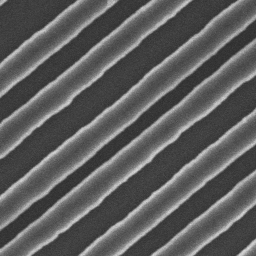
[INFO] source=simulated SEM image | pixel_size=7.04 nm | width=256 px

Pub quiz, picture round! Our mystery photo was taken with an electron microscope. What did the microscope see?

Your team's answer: lines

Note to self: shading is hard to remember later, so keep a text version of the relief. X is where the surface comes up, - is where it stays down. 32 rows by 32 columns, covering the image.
---------XXXXX----XXXXX------XXX
--------XXXXX----XXXXX------XXXX
-------XXXXX----XXXXX------XXXXX
------XXXX-----XXXXX------XXXXX-
----XXXXX-----XXXX------XXXXX---
---XXXXX----XXXXX------XXXXX---X
--XXXXX----XXXXX------XXXXX---XX
-XXXXX----XXXXX------XXXXX---XXX
XXXX-----XXXXX-----XXXXXX---XXXX
XXX-----XXXXX-----XXXXX---XXXXXX
XX----XXXXX------XXXXX---XXXXX--
X----XXXXX------XXXXX---XXXXX---
----XXXXX------XXXXX---XXXXX----
---XXXXX------XXXXX---XXXXX-----
-XXXXX------XXXXX---XXXXXX-----X
XXXXX------XXXXX---XXXXX------XX
XXXX------XXXXX---XXXXX-----XXXX
XXX-----XXXXXX---XXXXX-----XXXXX
XX-----XXXXXX---XXXX------XXXXX-
------XXXXX---XXXXX------XXXXX--
-----XXXXX---XXXXX------XXXXX---
----XXXXX---XXXXX-----XXXXX-----
---XXXXX--XXXXXX-----XXXXX----XX
-XXXXX---XXXXX------XXXXX----XXX
XXXXX---XXXXX------XXXXX----XXXX
XXXX---XXXXX------XXXXX----XXXXX
XXX---XXXXX------XXXX-----XXXXX-
XX---XXXXX-----XXXXX----XXXXXX--
---XXXXX------XXXXX----XXXXX----
--XXXXX------XXXXX----XXXXX-----
-XXXXX-----XXXXXX----XXXXX-----X
XXXX------XXXXX----XXXXXX-----XX